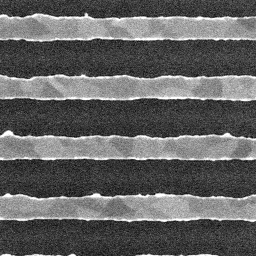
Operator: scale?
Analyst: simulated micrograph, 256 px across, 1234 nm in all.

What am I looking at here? lines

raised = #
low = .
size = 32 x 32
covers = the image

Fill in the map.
................................
................................
################################
################################
################################
................................
................................
................................
................................
.......#.......#................
################################
################################
.............................###
................................
................................
................................
................................
################################
################################
################################
................................
................................
................................
................................
###........##.....####.#.......#
################################
################################
..##.......#..##########...#..##
................................
................................
................................
................................